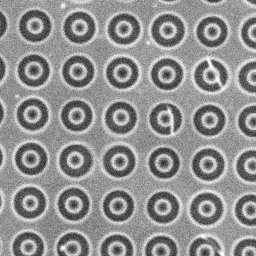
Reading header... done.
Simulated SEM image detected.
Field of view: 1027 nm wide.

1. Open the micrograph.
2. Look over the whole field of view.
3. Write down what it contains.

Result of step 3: an array of small figures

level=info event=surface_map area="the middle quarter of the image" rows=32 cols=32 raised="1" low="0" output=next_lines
00111000111001110011110000000111
01111000110001111001110011100011
01111000110001111001110011110011
00111001111001110001110011110011
00000001111000000011110001000011
10000011111100000111111000000111
11111111111111111111111110011111
11111111111111111111111111111111
11111111111111111111111111111111
10000111111110011111111111111111
00000001111000000111111000001111
00110001111000000011110000000111
01111001110001110011100011100111
01111001110011110011100111100011
00110001110001110011100011100011
00000001110000000011110001000111
10000111111000000111110000001111
11111111111100001111111100011111
11111111111111111111111111111111
11111111111111111111111111111111
10000011111100001111111111111111
00000001110000000111111000011111
00110001110000000011110000001111
01111000110011110011100111100111
01111000100011110011100111100111
00110001100011100011100111100111
00000001110000000111100011000111
00000011111000001111110000001111
11001111111110011111111100011111
11111111111111111111111111111111
11111111111111111111111111111111
00000111111110011111111111111111